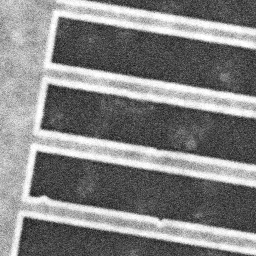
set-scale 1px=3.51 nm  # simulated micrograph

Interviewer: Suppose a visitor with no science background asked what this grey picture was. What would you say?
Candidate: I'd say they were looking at one or a few lines or trenches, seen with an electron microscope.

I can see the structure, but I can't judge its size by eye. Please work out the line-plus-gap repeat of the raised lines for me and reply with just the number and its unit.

237 nm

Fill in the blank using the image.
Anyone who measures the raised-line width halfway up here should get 0.0511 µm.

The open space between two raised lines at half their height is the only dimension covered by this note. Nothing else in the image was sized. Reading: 0.185 microns